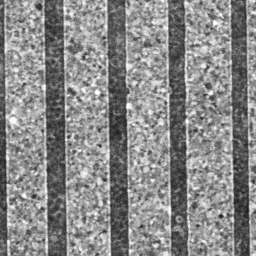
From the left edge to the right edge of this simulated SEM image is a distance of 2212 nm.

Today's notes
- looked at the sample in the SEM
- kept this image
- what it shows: one or a few lines or trenches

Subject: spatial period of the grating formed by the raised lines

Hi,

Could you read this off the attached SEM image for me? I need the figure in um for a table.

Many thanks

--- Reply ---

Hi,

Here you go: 0.528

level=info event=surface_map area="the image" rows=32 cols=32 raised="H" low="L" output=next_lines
LHHHHLLLHHHHHLLLHHHHHLLHHHHHHLLH
LHHHHLLLHHHHHLLLHHHHHLLHHHHHHLLH
LHHHHLLLHHHHHLLLHHHHHLLHHHHHHLLH
LHHHHLLLHHHHHLLLHHHHHLLHHHHHHLLH
LHHHHLLLHHHHHLLLHHHHHLLHHHHHHLLH
LHHHHLLLHHHHHLLLHHHHHLLHHHHHHLLH
LHHHHLLLHHHHHLLLHHHHHLLHHHHHHLLH
LHHHHHLLHHHHHLLLHHHHHLLHHHHHHLLH
LHHHHHLLHHHHHLLLHHHHHLLHHHHHHLLH
LHHHHHLLHHHHHLLLHHHHHLLHHHHHHLLH
LHHHHHLLHHHHHLLLHHHHHLLHHHHHHLLH
LHHHHHLLHHHHHLLLHHHHHLLHHHHHHLLH
LHHHHHLLHHHHHLLLHHHHHLLHHHHHHLLH
LHHHHHLLHHHHHLLLHHHHHLLHHHHHHLLH
LHHHHHLLHHHHHLLLHHHHHLLHHHHHHLLH
LHHHHHLLHHHHHLLLHHHHHLLHHHHHHLLH
LHHHHHLLHHHHHHLLHHHHHLLHHHHHHLLH
LHHHHHLLHHHHHHLLHHHHHLLHHHHHHLLH
LHHHHHLLHHHHHHLLHHHHHLLHHHHHHLLH
LHHHHHLLHHHHHHLLHHHHHLLHHHHHHLLH
LHHHHHLLHHHHHHLLHHHHHLLHHHHHHLLH
LHHHHHLLHHHHHLLLHHHHHLLHHHHHHLLH
LHHHHHLLHHHHHLLLHHHHHLLLHHHHHLLH
LHHHHHLLHHHHHHLLHHHHHLLLHHHHHLLH
LHHHHHLLHHHHHHLLHHHHHLLLHHHHHLLH
LHHHHHLLHHHHHHLLHHHHHLLLHHHHHLLH
LHHHHHLLHHHHHHLLHHHHHLLLHHHHHLLH
LHHHHHLLHHHHHHLLHHHHHLLLHHHHHLLH
LHHHHHLLHHHHHHLLHHHHHLLLHHHHHLLH
LHHHHHLLHHHHHHLLHHHHHLLLHHHHHLLH
LHHHHHLLLHHHHHLLHHHHHLLLHHHHHLLH
LHHHHHLLLHHHHHLLHHHHHLLLHHHHHLLH